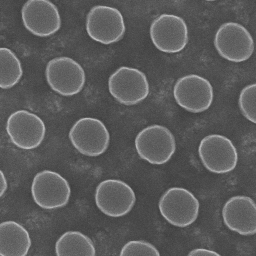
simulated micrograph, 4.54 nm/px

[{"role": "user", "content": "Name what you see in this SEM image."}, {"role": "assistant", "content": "a regular array of raised bodies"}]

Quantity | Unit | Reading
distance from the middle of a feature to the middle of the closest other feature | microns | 0.293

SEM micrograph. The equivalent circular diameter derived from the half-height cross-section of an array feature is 37.2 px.